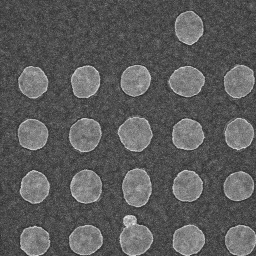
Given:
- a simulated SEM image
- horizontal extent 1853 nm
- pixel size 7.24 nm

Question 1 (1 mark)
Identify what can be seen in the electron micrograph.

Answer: a regular array of raised bodies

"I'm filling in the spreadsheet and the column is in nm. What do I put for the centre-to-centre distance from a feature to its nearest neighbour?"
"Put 372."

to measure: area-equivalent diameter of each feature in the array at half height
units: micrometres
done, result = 0.223